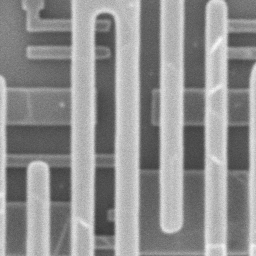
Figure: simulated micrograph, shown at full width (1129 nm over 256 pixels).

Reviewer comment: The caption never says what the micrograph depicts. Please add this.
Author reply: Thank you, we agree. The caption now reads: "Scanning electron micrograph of wiring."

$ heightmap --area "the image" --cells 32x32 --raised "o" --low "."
.........oooooooo...ooo...oo....
.........oooooooo...ooo...oo....
.........ooo..ooo...ooo...oo....
.........ooo...oo...ooo...oo....
.........ooo...oo...ooo...oo....
.........ooo...oo...ooo...oo....
.........ooo...oo...ooo...oo....
.........ooo...oo...ooo...oo....
.........ooo...oo...ooo...oo....
.........ooo...oo...ooo...oo...o
o........ooo...oo...ooo...oo...o
o........ooo...oo...ooo...oo...o
o........ooo...oo...ooo...oo...o
o........ooo...oo...ooo...oo...o
o........ooo...oo...ooo...oo...o
o........ooo...oo...ooo...oo...o
o........ooo...oo...ooo...oo...o
o........ooo..ooo...ooo...oo...o
o........ooo..ooo...ooo...oo...o
o........ooo..ooo...ooo...oo...o
o...oo...ooo..ooo...ooo...oo...o
o..ooo...ooo...oo...ooo...oo...o
o..ooo...ooo...oo...ooo...oo...o
o..ooo...ooo...oo...ooo...oo...o
o..ooo...ooo..ooo...ooo...oo...o
o..ooo...ooo..ooo...ooo...oo...o
o..ooo...ooo..ooo...ooo...oo...o
o..ooo...ooo..ooo...ooo...oo...o
o..ooo...ooo..ooo...ooo...oo...o
o..ooo...ooo..ooo.........oo...o
o..ooo...ooo..ooo.........oo...o
o..ooo...ooo..ooo.........oo...o